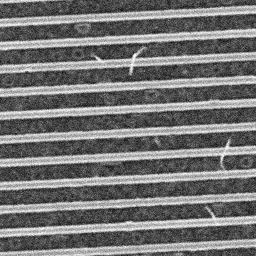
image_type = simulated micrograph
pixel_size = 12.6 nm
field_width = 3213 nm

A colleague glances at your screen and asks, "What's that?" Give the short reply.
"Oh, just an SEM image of parallel lines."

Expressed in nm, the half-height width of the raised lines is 75.2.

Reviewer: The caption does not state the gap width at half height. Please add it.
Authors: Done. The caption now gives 213 nanometers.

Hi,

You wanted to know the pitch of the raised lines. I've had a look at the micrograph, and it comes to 293 nanometres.